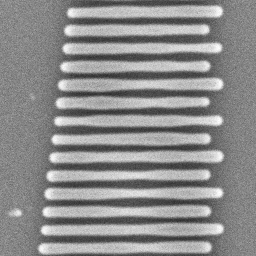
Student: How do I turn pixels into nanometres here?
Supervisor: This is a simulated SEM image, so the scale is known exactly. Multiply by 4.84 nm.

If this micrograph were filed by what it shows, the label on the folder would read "groups of lines, slits or small figures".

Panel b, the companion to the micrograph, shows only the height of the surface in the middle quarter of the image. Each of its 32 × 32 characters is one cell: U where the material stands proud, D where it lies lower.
UUUUUUUUUUUUUUUUUUUUUUUUUUUUUUUU
UUUUUUUUUUUUUUUUUUUUUUUUUUUUDDDD
DDDDDDDDDDDDDDDDDDDDDDDDDDDDDDDD
DDDDDDDDDDDDDDDDDDDDDDDDDDDDDDDD
UUUUUUUUUUUUUUUUUUUUUUUUUUUUUUUU
UUUUUUUUUUUUUUUUUUUUUUUUUUUUUUUU
DUUUUUUUUUUUDDDDDDDDDDDDDDDDDDDD
DDDDDDDDDDDDDDDDDDDDDDDDDDDDDDDD
DDUUUUUUUUUUUUDDDDDDDDDDDDUUUUUU
UUUUUUUUUUUUUUUUUUUUUUUUUUUUUUUU
UUUUUUUUUUUUUUUUUUUUUUUUUUUUUUUU
DDDDDDDDDDDDDDDDDDDDDDDDDDDDDDDD
DDDDDDDDDDDDDDDDDDDDDDDDDDDDDDDD
UUUUUUUUUUUUUUUUUUUUUUUUUUUUUUUU
UUUUUUUUUUUUUUUUUUUUUUUUUUUUUUUU
DDDDDDDDDDDDDDDDDDDDDDDDDDDDDDDD
DDDDDDDDDDDDDDDDDDDDDDDDDDDDDDDD
DDDDDDDDDDDDDDDDDDDUUUUUUUUUUUDD
UUUUUUUUUUUUUUUUUUUUUUUUUUUUUUUU
UUUUUUUUUUUUUUUUUUUUUUUUUUUUUUUU
DDDDDDDDDDDDDDDDDDDDDDDDDDDDDDDD
DDDDDDDDDDDDDDDDDDDDDDDDDDDDDDDD
UUUUUUUUUUUUUUUUUUUUUUUUUUUUUUUU
UUUUUUUUUUUUUUUUUUUUUUUUUUUUUUUU
UUUUUDDDDDDDDDDDDDDDDDDDDDDDDDDD
DDDDDDDDDDDDDDDDDDDDDDDDDDDDDDDD
DDDDDDDDDDDDDDDDDDDDDDDDDDDDDDDD
UUUUUUUUUUUUUUUUUUUUUUUUUUUUUUUU
UUUUUUUUUUUUUUUUUUDUUUUUUUUUUUUU
DDDDDDDDDDDDDDDDDDDDDDDDDDDDDDDD
DDDDDDDDDDDDDDDDDDDDDDDDDDDDDDDD
UUUUUUUUUUUUUUUUDDDDDUUUUUUUUUUU